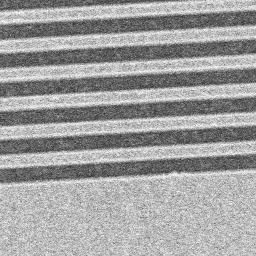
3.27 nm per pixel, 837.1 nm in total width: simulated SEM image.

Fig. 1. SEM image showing parallel lines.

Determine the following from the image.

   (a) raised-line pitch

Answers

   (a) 93.9 nm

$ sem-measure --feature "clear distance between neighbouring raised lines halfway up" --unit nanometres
54.2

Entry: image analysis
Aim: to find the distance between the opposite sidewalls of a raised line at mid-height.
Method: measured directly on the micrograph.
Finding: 39.9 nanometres